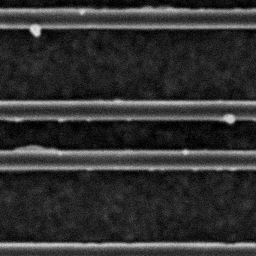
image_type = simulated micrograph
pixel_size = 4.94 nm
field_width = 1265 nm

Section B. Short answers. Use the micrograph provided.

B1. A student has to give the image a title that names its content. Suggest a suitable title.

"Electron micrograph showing lines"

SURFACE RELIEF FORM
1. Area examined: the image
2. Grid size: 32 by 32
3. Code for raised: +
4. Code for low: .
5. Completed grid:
................................
++++++++++++++++++++++++++++++++
++++++++++++++++++++++++++++++++
...++...........................
................................
................................
................................
................................
................................
................................
................................
................................
................................
++++++++++++++++++++++++++++++++
++++++++++++++++++++++++++++++++
................................
................................
................................
................................
++++++++++++++++++++++++++++++++
++++++++++++++++++++++++++++++++
................................
................................
................................
................................
................................
................................
................................
................................
................................
++++++++++++.+++++++++++++++.+++
++++++++++++++++++++++++++++++++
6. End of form